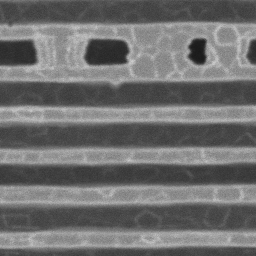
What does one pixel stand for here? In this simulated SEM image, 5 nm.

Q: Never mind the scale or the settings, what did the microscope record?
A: parallel lines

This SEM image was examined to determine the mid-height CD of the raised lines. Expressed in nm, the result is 80.6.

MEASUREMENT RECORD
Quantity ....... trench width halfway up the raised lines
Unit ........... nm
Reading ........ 128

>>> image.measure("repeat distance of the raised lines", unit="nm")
207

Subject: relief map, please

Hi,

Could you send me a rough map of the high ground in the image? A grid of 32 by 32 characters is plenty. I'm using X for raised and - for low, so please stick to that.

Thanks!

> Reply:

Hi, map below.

--------------------------------
--------------------------------
--------------------------------
XXXXXXXXXXXXXXXXXXXXXXXXXXXXXXXX
XXXXXXXXXXXXXXXXXXXXXXXXXXXXXXXX
----XXXXXXX-----XXXXXXXX--XXXXX-
----XXXXXXX-----XXXXXXXX--XXXXX-
-----XXXXXX-----XXXXXXXX--XXXXX-
XXXXXXXXXXXXXXXXXXXXXXXXXXXXXXXX
XXXXXXXXXXXXXXXXXXXXXXXXXXXXXXXX
--------------X-----------------
--------------------------------
--------------------------------
XXXXXXXXXXXXXXX-XXXXXXXXXXXXXXXX
XXXXXXXXXXXXXXXXXXXXXXXXXXXXXXXX
--------------------------------
--------------------------------
--------------------------------
----------------------XXXXXXXXXX
XXXXXXXXXXXXXXXXXXXXXXXXXXXXXXXX
----XXXXXXXXXX-------XXXXXX-----
--------------------------------
--------------------------------
XXXXXXXXXXXXXXXXXXXXXXXXXXXXXXXX
XXXXXXXXXXXXXXXXXXXXXXXXXXXXXXXX
-----XXXXXXXXX------------------
--------------------------------
--------------------------------
--------------------------------
XXXXXXXXXXXXXXXXXXXXXXXXXXXXXXXX
XXXXXXXXXXXXXXXXXXXXXXXXXXXXXXXX
--------------------------------